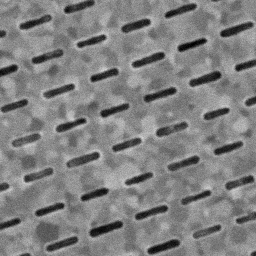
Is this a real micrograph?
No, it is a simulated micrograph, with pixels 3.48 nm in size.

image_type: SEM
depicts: a regular array of holes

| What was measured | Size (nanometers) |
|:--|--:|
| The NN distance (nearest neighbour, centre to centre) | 126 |